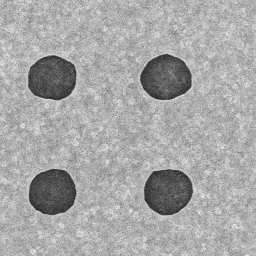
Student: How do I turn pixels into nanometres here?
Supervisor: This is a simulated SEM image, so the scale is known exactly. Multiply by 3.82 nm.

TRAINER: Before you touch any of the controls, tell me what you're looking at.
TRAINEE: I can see holes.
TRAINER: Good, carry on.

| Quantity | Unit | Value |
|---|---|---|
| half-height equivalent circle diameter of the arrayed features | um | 0.182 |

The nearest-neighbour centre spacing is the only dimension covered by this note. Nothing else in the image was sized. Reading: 434 nm